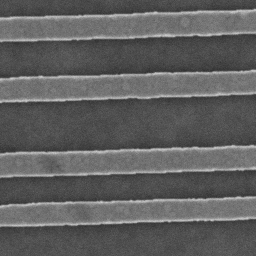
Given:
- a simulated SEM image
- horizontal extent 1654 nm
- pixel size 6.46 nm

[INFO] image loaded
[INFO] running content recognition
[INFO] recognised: lines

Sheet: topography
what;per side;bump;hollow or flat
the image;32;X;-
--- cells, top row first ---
--------------------------------
-------------------------XXXXXXX
XXXXXXXXXXXXXXXXXXXXXXXXXXXXXXXX
XXXXXXXXXXXXXXXXXXXXXXXXXXXXXXXX
XXXXXXXXXXXXXXXXXXXX-X----------
--------------------------------
--------------------------------
--------------------------------
--------------------------------
-------------XXXXXXXXXXXXXXXXXXX
XXXXXXXXXXXXXXXXXXXXXXXXXXXXXXXX
XXXXXXXXXXXXXXXXXXXXXXXXXXXXXXXX
XXXXXXXX------------------------
--------------------------------
--------------------------------
--------------------------------
--------------------------------
--------------------------------
---------------------------XXXXX
XXXXXXXXXXXXXXXXXXXXXXXXXXXXXXXX
XXXXXXXXXXXXXXXXXXXXXXXXXXXXXXXX
XXXXXXXXXXXXXXXXXXXXX-----------
--------------------------------
--------------------------------
--------------------------------
---XXXXXXXXXXXXXXXXXXXXXXXXXXXXX
XXXXXXXXXXXXXXXXXXXXXXXXXXXXXXXX
XXXXXXXXXXXXXXXXXXXXXXXXX-------
--------------------------------
--------------------------------
--------------------------------
--------------------------------